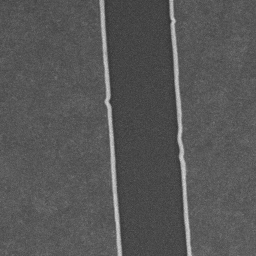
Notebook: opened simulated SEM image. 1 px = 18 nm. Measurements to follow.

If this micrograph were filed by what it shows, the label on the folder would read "one or a few lines or trenches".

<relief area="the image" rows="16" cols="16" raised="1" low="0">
1111110000011111
1111110000011111
1111110000011111
1111111000011111
1111111000011111
1111111000011111
1111111000011111
1111111000011111
1111111000011111
1111111000011111
1111111000011111
1111111000001111
1111111000001111
1111111000001111
1111111000001111
1111111000001111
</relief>